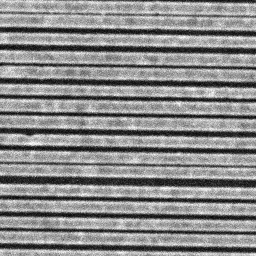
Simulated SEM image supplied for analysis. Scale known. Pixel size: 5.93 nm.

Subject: parallel lines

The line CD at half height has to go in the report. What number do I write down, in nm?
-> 63.7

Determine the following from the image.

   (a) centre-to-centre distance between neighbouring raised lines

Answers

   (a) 98 nanometers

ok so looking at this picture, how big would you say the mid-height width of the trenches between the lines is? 42.2 nanometers